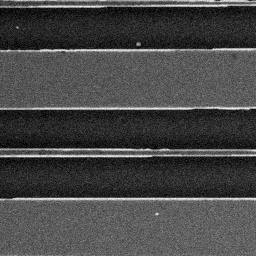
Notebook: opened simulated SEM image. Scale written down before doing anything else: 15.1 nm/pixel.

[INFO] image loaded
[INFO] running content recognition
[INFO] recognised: lines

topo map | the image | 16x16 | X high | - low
----------------
----------------
----------------
XXXXXXXXXXXXXXXX
XXXXXXXXXXXXXXXX
XXXXXXXXXXXXXXXX
XXXXXXXXXXXXXXXX
----------------
----------------
----------------
----------------
----------------
XXXXXXXXXXXXXXXX
XXXXXXXXXXXXXXXX
XXXXXXXXXXXXXXXX
XXXXXXXXXXXXXXXX